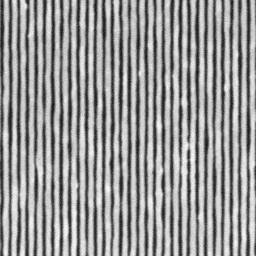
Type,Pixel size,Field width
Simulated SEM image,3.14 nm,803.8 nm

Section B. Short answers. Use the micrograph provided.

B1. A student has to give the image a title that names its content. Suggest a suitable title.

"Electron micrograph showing parallel lines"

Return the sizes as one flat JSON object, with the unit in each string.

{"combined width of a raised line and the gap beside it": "26.7 nm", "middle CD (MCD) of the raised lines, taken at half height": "14.5 nm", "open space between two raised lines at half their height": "0.0118 microns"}